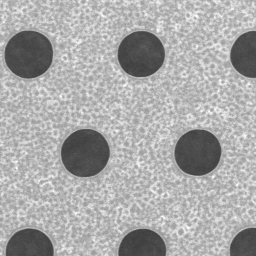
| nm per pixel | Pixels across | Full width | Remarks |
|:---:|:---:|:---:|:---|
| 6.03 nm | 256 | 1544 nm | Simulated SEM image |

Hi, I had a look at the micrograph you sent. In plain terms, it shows holes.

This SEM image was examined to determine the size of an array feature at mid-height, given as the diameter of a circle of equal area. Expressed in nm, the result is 289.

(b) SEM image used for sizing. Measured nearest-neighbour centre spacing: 0.679 micrometres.